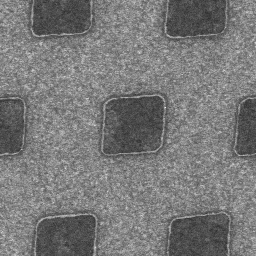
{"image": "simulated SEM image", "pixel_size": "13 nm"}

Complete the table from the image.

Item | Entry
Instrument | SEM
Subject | raised bodies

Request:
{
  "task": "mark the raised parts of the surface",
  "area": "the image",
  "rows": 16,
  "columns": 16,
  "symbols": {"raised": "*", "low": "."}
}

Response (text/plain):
..****....****..
..****....****..
................
................
................
................
*......***.....*
**....****.....*
*.....****.....*
*......**......*
................
................
................
....**......**..
..****.....***..
..****....****..